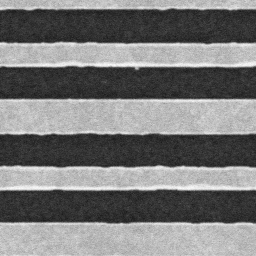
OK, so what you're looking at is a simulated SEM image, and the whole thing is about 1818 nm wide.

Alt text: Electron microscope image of lines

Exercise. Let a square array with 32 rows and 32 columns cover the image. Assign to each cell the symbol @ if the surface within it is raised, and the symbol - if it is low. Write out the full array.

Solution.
@@@@@@@@@@@@@@@@@@@@@@@@@@@@@@@@
--------------------------------
--------------------------------
--------------------------------
--------------------------------
@----@-@@@@@-----------------@--
@@@@@@@@@@@@@@@@@@@@@@@@@@@@@@@@
@@@@@@@@@@@@@@@@@@@@@@@@@@@@@@@@
--------------------------------
--------------------------------
--------------------------------
--------------------------------
--------------------------------
@@@@@@@@@@@@@@@@@@@@@@@@@@@@@@@@
@@@@@@@@@@@@@@@@@@@@@@@@@@@@@@@@
@@@@@@@@@@@@@@@@@@@@@@@@@@@@@@@@
@@@@@@@@@@@@@@@@@@@@@@@@@@@@@@@@
--------------------------------
--------------------------------
--------------------------------
--------------------------------
@@@@@@@@@@@@@@@@@@@@@@@@@@@@@@@@
@@@@@@@@@@@@@@@@@@@@@@@@@@@@@@@@
@@---@@@@@@@@@@@@@@---@@----@@@@
--------------------------------
--------------------------------
--------------------------------
--------------------------------
@@@@@@@@@@@@@@@@@@@@@@@@@@@@@@@@
@@@@@@@@@@@@@@@@@@@@@@@@@@@@@@@@
@@@@@@@@@@@@@@@@@@@@@@@@@@@@@@@@
@@@@@@@@@@@@@@@@@@@@@@@@@@@@@@@@